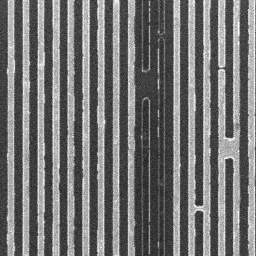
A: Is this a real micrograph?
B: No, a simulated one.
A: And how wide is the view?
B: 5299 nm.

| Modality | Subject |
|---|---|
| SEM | parallel lines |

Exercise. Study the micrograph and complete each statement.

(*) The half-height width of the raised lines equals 0.122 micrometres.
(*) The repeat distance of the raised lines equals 311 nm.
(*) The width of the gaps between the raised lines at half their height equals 204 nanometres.